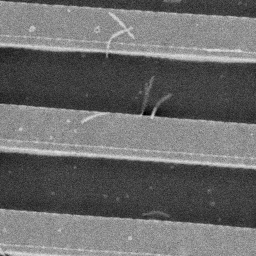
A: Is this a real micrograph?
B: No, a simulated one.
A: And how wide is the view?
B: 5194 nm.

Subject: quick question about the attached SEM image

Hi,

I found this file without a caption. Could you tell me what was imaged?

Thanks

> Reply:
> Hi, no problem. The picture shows lines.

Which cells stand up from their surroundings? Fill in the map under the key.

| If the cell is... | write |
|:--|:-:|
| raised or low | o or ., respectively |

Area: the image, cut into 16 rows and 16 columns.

oooooo..........
oooooooooooooooo
oooooooooooooooo
..........oooooo
................
................
................
oooooooooooo....
oooooooooooooooo
...ooooooooooooo
................
................
................
ooooo...........
oooooooooooooooo
oooooooooooooooo